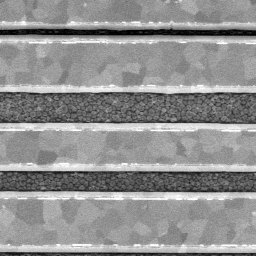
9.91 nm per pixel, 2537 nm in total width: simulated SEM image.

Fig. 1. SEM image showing one or a few lines or trenches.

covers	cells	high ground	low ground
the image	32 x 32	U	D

UUUUUUUUUUUUUUUUUUUUUUUUUUUUUUUU
UUUUUUUUUUUUUUUUUUUUUUUUUUUUUUUU
UUUUUUUUUUUUUUUUUUUUUUUUUUUUUUUU
DDDDDDDDDDDDDDDDDDDDDDDDDDDDDDDD
DDDDDDDDDDDDDDDDDDDDDDDDDDDDDDDD
UUUUUUUUUUUUUUUUUUUUUUUUUUUUUUUU
UUUUUUUUUUUUUUUUUUUUUUUUUUUUUUUU
UUUUUUUUUUUUUUUUUUUUUUUUUUUUUUUU
UUUUUUUUUUUUUUUUUUUUUUUUUUUUUUUU
UUUUUUUUUUUUUUUUUUUUUUUUUUUUUUUU
UUUUUUUUUUUUUUUUUUUUUUUUUUUUUUUU
DDDDDDDDDDDDDDDDDDDDDDDDDDDDDDDD
DDDDDDDDDDDDDDDDDDDDDDDDDDDDDDDD
DDDDDDDDDDDDDDDDDDDDDDDDDDDDDDDD
DDDDDDDDDDDDDDDDDDDDDDDDDDDDDDDD
DDDDDDDDDDDDDDDDDDDDDDDDDDDDDDDD
UUUUUUUUUUUUUUUUUUUUUUUUUUUUUUUU
UUUUUUUUUUUUUUUUUUUUUUUUUUUUUUUU
UUUUUUUUUUUUUUUUUUUUUUUUUUUUUUUU
UUUUUUUUUUUUUUUUUUUUUUUUUUUUUUUU
UUUUUUUUUUUUUUUUUUUUUUUUUUUUUUUU
DDDDDDDDDDDDDDDDDDDDDDDDDDDDDDDD
DDDDDDDDDDDDDDDDDDDDDDDDDDDDDDDD
DDDDDDDDDDDDDDDDDDDDDDDDDDDDDDDD
UUUUUUUUUUUUUUUUUUUUUUUUUUUUUUUU
UUUUUUUUUUUUUUUUUUUUUUUUUUUUUUUU
UUUUUUUUUUUUUUUUUUUUUUUUUUUUUUUU
UUUUUUUUUUUUUUUUUUUUUUUUUUUUUUUU
UUUUUUUUUUUUUUUUUUUUUUUUUUUUUUUU
UUUUUUUUUUUUUUUUUUUUUUUUUUUUUUUU
UUUUUUUUUUUUUUUUUUUUUUUUUUUUUUUU
DDDDDDDDDDDDDDDDDDDDDDDDDDDDDDDD